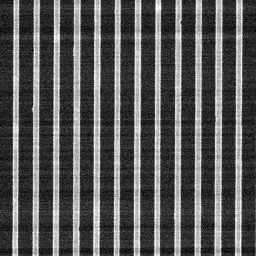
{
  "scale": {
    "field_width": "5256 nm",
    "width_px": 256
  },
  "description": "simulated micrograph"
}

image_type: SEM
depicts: parallel lines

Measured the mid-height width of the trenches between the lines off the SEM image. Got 310 nm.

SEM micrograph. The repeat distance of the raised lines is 416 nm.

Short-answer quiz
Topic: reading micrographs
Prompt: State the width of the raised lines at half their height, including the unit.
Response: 105 nanometres